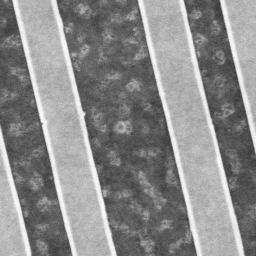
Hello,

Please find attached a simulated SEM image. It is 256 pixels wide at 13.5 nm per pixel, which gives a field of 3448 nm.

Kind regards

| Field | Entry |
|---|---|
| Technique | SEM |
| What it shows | one or a few lines or trenches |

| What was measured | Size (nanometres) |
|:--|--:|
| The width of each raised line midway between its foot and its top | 536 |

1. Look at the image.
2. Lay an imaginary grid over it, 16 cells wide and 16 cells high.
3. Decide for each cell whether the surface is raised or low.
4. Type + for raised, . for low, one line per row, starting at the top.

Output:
.++......++...++
.+++.....+++..++
.+++.....+++..++
..++......++...+
..++......++...+
..+++.....+++..+
..+++.....+++..+
...++......++...
...++......++...
...+++.....+++..
...+++.....+++..
+...++.....+++..
+...++......++..
+...+++.....+++.
+...+++.....+++.
++...++.....+++.